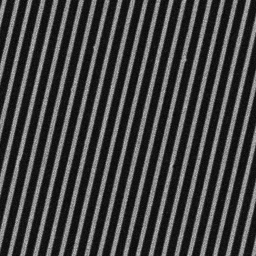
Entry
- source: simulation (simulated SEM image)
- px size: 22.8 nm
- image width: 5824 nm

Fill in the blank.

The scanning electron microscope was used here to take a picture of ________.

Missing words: parallel lines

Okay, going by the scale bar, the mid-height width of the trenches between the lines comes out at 180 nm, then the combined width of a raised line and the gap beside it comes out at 285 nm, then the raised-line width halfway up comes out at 4.39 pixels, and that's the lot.